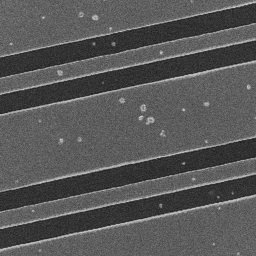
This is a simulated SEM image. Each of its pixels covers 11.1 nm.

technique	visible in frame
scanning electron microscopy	lines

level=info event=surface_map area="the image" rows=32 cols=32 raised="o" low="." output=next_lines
ooooooooooooooooooooooooooooooo.
oooooooooooooooooooooooooo......
oooooooooooooooooooooo..........
ooooooooooooooooo............ooo
ooooooooooooo............ooooooo
ooooooo.............ooooooooo...
ooo............oooooooooo.......
...........ooooooooo............
......ooooooooo.............oooo
.oooooooooo............ooooooooo
oooooo.............ooooooooooooo
o............ooooooooooooooooooo
.........ooooooooooooooooooooooo
....oooooooooooooooooooooooooooo
oooooooooooooooooooooooooooooooo
oooooooooooooooooooooooooooooooo
oooooooooooooooooooooooooooooooo
oooooooooooooooooooooooooooooo..
oooooooooooooooooooooooooo......
ooooooooooooooooooooo...........
oooooooooooooooo............oooo
ooooooooooo............ooooooooo
ooooooo............oooooooooo...
ooo............ooooooooo........
.........oooooooooo............o
.....ooooooooo.............ooooo
oooooooooo............oooooooooo
ooooo............ooooooooooooooo
o............ooooooooooooooooooo
........oooooooooooooooooooooooo
...ooooooooooooooooooooooooooooo
oooooooooooooooooooooooooooooooo